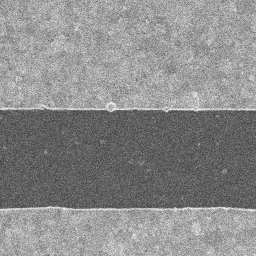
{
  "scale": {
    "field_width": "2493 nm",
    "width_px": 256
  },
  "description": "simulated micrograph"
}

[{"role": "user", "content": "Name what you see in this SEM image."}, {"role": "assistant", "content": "one or a few lines or trenches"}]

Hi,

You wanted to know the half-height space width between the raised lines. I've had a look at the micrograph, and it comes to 99.3 px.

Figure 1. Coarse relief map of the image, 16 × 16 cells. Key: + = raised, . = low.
++++++++++++++++
++++++++++++++++
++++++++++++++++
++++++++++++++++
++++++++++++++++
++++++++++++++++
++++++++++++++++
................
................
................
................
................
................
++++++++++++++++
++++++++++++++++
++++++++++++++++